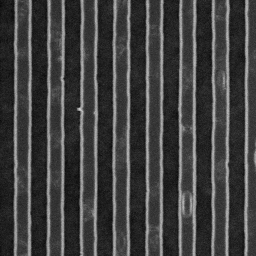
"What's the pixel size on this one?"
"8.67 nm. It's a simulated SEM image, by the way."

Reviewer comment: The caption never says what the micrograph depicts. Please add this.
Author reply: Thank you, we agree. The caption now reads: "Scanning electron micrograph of parallel lines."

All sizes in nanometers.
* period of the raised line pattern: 286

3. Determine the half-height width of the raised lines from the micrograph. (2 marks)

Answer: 125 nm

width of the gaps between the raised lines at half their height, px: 18.3